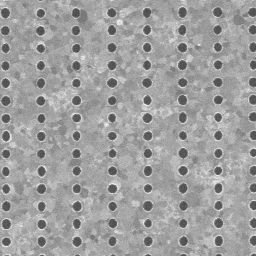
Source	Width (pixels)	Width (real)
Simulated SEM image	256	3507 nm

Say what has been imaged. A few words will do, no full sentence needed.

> a regular array of holes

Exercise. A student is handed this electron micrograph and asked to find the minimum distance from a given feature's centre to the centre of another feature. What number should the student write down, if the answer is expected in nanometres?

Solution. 239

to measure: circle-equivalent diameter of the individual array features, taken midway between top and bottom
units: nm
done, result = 133